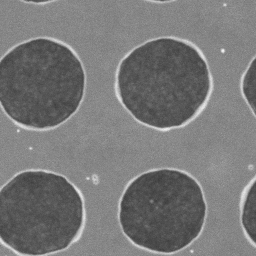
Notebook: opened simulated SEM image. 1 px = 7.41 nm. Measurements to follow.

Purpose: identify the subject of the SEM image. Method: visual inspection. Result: holes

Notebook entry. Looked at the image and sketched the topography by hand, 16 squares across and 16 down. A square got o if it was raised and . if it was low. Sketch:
oooooooooooooooo
oooooooooooooooo
oo.ooooooo.ooooo
.....ooo.....ooo
.....oo......oo.
.....oo......oo.
.....ooo.....ooo
o...ooooo...oooo
oooooooooooooooo
oooooooooooooooo
oooooooooooooooo
....oooo....oooo
.....ooo.....oo.
.....ooo.....oo.
.....ooo....ooo.
o...ooooo..ooooo